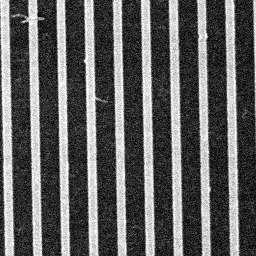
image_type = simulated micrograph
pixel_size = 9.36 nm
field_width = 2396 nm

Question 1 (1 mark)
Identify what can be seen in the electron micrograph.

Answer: parallel lines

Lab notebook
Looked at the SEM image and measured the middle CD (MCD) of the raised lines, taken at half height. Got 74.9 nm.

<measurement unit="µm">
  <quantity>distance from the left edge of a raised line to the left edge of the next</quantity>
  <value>0.263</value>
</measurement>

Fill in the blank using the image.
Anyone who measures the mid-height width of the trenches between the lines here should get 193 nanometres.